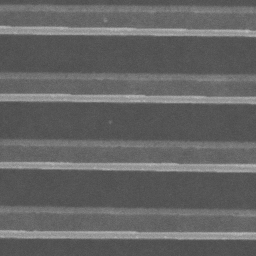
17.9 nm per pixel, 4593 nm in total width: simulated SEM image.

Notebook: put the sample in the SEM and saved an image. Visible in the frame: lines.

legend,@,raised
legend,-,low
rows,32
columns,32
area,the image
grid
--------------------------------
@@@@@@@@@@@@@@@@@@@@@@@@@@@@@@@@
@@@@@@@@@@@@@@@@@@@@@@@@@@@@@@@@
@@@@@@@@@@@@@@@@@@@@@@@@@@@@@@@@
------------------------------@@
--------------------------------
--------------------------------
--------------------------------
--------------------------------
--------------------------------
@@@@@@@@@@@@@@@@@@@@@@@@@@@@@@@@
@@@@@@@@@@@@@@@@@@@@@@@@@@@@@@@@
@@@@@@@@@@@@@@@@@@@@@@@@@@@@@@@@
--------------------------------
--------------------------------
--------------------------------
--------------------------------
--------------------------------
@@@@@@@@@@@@@@@@@@@@@@@@@@@@@@@@
@@@@@@@@@@@@@@@@@@@@@@@@@@@@@@@@
@@@@@@@@@@@@@@@@@@@@@@@@@@@@@@@@
--------------------------------
--------------------------------
--------------------------------
--------------------------------
--------------------------------
@@@-----------------------------
@@@@@@@@@@@@@@@@@@@@@@@@@@@@@@@@
@@@@@@@@@@@@@@@@@@@@@@@@@@@@@@@@
@@@@@@@@@@@@@@@@@@@@@@@@@@@@@@@@
--------------------------------
--------------------------------